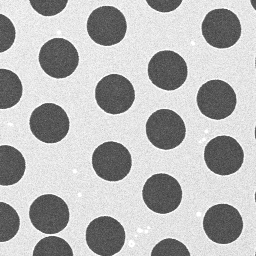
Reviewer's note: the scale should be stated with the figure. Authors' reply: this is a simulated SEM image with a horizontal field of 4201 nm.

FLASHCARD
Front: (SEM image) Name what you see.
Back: a regular array of holes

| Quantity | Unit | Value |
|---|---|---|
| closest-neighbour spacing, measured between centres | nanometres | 968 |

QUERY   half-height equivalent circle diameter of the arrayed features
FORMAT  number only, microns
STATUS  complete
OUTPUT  0.663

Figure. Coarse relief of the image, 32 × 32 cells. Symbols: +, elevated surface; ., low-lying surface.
++++....+++++++++++....++++++++.
+++++...++++...+++++.+++++...+++
.++++++++++.....+++++++++.....++
..+++++++++.....+++++++++.....++
..+++++++++.....+++++++++.....++
..++++...+++..++++++++++++...+++
+++++.....++++++++++..++++++++++
+++++.....+++++++++....+++++++++
+++++.....++++++++.....+++++++++
..++++...++++..++++....+++++++++
...+++++++++....+++....++....+++
...+++++++++.....++++++++....+++
..++++++++++.....++++++++.....++
.++++...+++++...+++++++++....+++
++++....+++++++++++...++++...+++
++++.....+++++++++.....+++++++++
++++....++++++++++.....+++++++++
+++++...+++++++++++....+++...+++
..++++++++++....++++..++++....++
...+++++++++....+++++++++.....++
...+++++++++....++++++++++....++
...+++++++++....+++++++++++..+++
...++++++++++..+++....++++++++++
++++++++++++++++++.....+++++++++
+++++..+++++++++++.....+++++++++
.+++....++++++++++.....++++.++++
..++.....++++++++++..+++++....++
..++.....+++...++++++++++.....++
..++....+++....++++++++++.....++
..++++.++++.....++++++++++....++
+++++....++.....++++...+++++++++
++++.....+++...++++.....++++++++